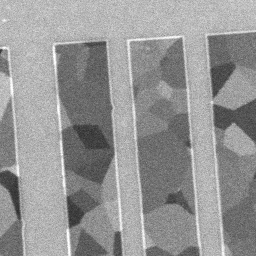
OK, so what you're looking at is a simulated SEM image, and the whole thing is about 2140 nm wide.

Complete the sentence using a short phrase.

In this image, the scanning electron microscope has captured one or a few lines or trenches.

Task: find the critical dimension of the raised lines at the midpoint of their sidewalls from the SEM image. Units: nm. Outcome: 458